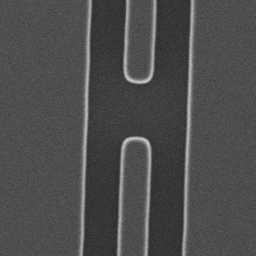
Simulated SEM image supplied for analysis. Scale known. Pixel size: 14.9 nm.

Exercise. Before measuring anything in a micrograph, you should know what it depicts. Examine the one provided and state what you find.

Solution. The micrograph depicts groups of lines, slits or small figures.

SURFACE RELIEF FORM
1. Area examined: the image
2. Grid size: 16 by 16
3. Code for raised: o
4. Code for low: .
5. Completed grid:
oooooo..oo..oooo
oooooo..oo..oooo
oooooo..oo..oooo
oooooo..oo..oooo
oooooo..o...oooo
ooooo.......oooo
ooooo.......oooo
ooooo.......oooo
ooooo.......oooo
ooooo...o...oooo
ooooo...o...oooo
ooooo...o...oooo
ooooo...o...oooo
ooooo..oo...oooo
ooooo..oo...oooo
ooooo..oo..ooooo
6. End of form